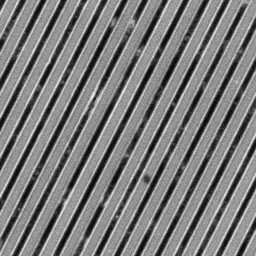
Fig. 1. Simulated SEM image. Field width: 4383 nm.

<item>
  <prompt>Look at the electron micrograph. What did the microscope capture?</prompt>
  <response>parallel lines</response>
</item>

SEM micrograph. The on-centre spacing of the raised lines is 310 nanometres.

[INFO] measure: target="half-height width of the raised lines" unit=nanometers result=141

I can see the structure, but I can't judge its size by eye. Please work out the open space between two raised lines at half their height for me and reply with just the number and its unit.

172 nanometers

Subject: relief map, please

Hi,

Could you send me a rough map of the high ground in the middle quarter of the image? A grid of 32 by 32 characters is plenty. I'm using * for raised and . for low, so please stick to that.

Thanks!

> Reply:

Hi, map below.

.**...**...**...**...**...**...*
**...***..***..**...***...**...*
**...**...**...**...**...**...**
*...***..***..**...***...**...**
*...**...**...**...**...**...**.
...**...**...**...***...**...**.
...**...**...**...**...**...**..
..**...**...**...***..***...**..
..**...**...**...**...**...**...
.**...**...**...***..***...**...
.**...**...**...**...**...**...*
**...**...**...***..***...**...*
**...**...**...**...**...**...**
*...**...**...***..***...**...**
*...**...**...**...**...**...**.
...**...**...***..***...**...**.
...**...**...**...**...**...**..
..**...**...***..***...**...**..
..**...**...**...**...**...**...
.**...**...***..***..***...**...
.**...**...**...**...**...**...*
**...**...***..***..***...**...*
**...**...**...**...**...**...**
*...**...***..***..***...**...**
*...**...**...**...**...**...**.
...**...***..***..***...**...**.
...**...**...**...**...**...**..
..**...***..**...***...**...**..
..**...**...**...**...**...**...
.**...***..**...***...**...**...
.**...**...**...**...**...**...*
**...***..**...***...**...**...*